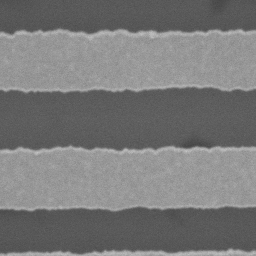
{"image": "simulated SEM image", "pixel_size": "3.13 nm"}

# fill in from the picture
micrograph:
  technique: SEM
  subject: lines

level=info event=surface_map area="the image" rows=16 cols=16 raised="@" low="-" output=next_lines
----------------
----------------
@@@@@@@@@@@@@@@@
@@@@@@@@@@@@@@@@
@@@@@@@@@@@@@@@@
@@@@@@@@@@----@@
----------------
----------------
----------------
@@@@@@@@@@@@@@@@
@@@@@@@@@@@@@@@@
@@@@@@@@@@@@@@@@
@@@@@@@@@@@@@@@@
----------------
----------------
----------------